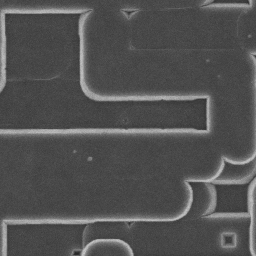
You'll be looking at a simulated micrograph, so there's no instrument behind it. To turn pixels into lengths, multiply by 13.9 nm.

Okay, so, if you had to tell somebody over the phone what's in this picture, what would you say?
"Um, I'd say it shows wiring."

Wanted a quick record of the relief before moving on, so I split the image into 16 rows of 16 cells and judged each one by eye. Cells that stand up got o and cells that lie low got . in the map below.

oooooooooooooooo
.....ooooooooooo
.....ooooooooooo
.....ooooooooooo
.....ooooooooooo
.....ooooooooooo
.............ooo
.............ooo
oooooooooooooooo
oooooooooooooooo
oooooooooooooo..
oooooooooooo....
oooooooooooo....
ooooooooooo.....
................
.....ooo........